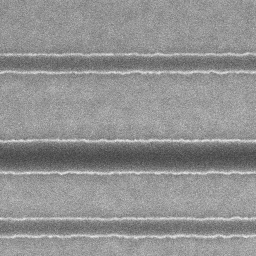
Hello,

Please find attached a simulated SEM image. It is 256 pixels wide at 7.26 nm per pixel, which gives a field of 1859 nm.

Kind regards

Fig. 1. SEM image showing lines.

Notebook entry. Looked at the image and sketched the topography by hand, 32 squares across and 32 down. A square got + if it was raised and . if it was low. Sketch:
................................
................................
................................
................................
................................
................................
................................
++++++++++++++++++++++++++++++++
++++++++++++++++++++++++++++++++
................................
................................
................................
................................
................................
................................
................................
................................
................................
++++++++++++++++++++++++++++++++
++++++++++++++++++++++++++++++++
++++++++++++++++++++++++++++++++
++++++++++++++++++++++++++++++++
................................
................................
................................
................................
................................
++++++++++++++++++++++++++++++++
++++++++++++++++++++++++++++++++
++.++.+++..+...+++++++..+++.+.+.
................................
................................